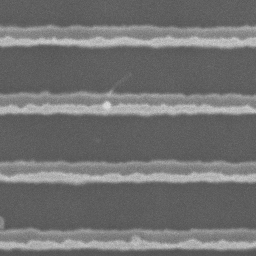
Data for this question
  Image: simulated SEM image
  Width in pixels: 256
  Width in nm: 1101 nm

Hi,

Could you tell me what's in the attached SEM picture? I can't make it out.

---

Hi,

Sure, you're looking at lines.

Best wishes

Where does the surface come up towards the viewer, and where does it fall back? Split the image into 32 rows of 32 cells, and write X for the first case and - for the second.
--------------------------------
--------------------------------
--------------------------------
------X--XX-----X-X-----------XX
XXXXXXXXXXXXXXXXXXXXXXXXXXXXXXXX
XXXXX--XXXXXXXXXXXXXXXXXXXXXXXXX
--------------------------------
--------------------------------
--------------------------------
--------------------------------
--------------------------------
--------------------------------
XXXXXXXXXXXXXXXXXXXXXXXXXXXXXXXX
XXXXXXXXXXXXXXXXXXXXXXXXXXXXXXXX
--------------------------------
--------------------------------
--------------------------------
--------------------------------
--------------------------------
--------------------------------
XXXXXXXXXXXXXX-XXXXXXXXXXXXXX-XX
XXXXXXXXXXXXXXXXXXXXXXXXXXXXXXXX
XXXXXXXXXXXXXXXXXXXXXXXXXXXXXXXX
--------------------------------
--------------------------------
--------------------------------
--------------------------------
--------------------------------
--------------------------------
XXXXXXXXXXXXXXXXXXXXXXXXXXXXXXXX
XXXXXXXXXXXXXXXXXXXXXXXXXXXXXXXX
--------------------------------